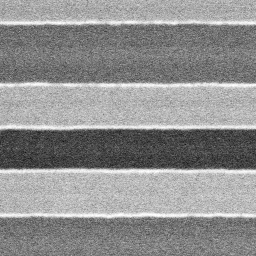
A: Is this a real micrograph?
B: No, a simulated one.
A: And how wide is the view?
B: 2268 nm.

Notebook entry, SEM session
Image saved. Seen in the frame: lines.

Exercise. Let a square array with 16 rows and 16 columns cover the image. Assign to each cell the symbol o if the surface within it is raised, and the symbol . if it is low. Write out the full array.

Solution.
oooooooooooooooo
................
................
................
................
oooooooooooooooo
oooooooooooooooo
oooooooooooooooo
................
................
................
oooooooooooooooo
oooooooooooooooo
......o.........
................
................